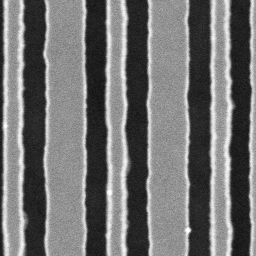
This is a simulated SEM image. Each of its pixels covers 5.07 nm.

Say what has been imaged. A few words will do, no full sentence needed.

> lines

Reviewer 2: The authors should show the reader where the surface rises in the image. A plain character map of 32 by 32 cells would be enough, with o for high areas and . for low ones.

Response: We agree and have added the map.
ooo...ooooo..ooo...ooooo..ooo..o
.oo...ooooo..ooo...ooooo..ooo..o
.oo...ooooo..ooo...oooo...ooo..o
.oo...ooooo..ooo...ooooo..ooo..o
ooo...ooooo..ooo...ooooo..ooo..o
.oo...ooooo..ooo...ooooo..ooo..o
.oo...ooooo..ooo...ooooo..ooo..o
.oo...ooooo..ooo...ooooo..ooo..o
.oo...ooooo..ooo...ooooo..ooo..o
ooo...ooooo..ooo...ooooo..ooo..o
ooo...ooooo..ooo...ooooo..ooo..o
ooo...ooooo..ooo...ooooo..ooo..o
.oo...ooooo..ooo..ooooo...ooo..o
ooo...ooooo..ooo..oooooo..ooo..o
ooo...ooooo..ooo...ooooo..ooo..o
ooo...ooooo..ooo...ooooo..ooo..o
ooo...ooooo..ooo...ooooo..ooo..o
ooo...ooooo..ooo...ooooo..ooo..o
ooo...ooooo..ooo...ooooo..ooo..o
ooo...ooooo..ooo...ooooo..ooo..o
ooo...ooooo..ooo...ooooo..ooo..o
ooo...ooooo...oo...oooo...ooo..o
ooo...ooooo..ooo..oooooo..ooo..o
ooo...ooooo..ooo..oooooo..ooo..o
ooo...ooooo..ooo...ooooo..ooo..o
ooo...ooooo..ooo..oooooo..ooo..o
ooo...ooooo..ooo..oooooo..ooo..o
ooo...ooooo..ooo...ooooo..ooo..o
ooo...ooooo..ooo...ooooo..ooo..o
ooo...ooooo..ooo...ooooo..ooo..o
ooo...ooooo..ooo...ooooo..ooo..o
.oo...ooooo..ooo...ooooo..ooo..o